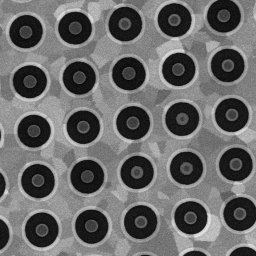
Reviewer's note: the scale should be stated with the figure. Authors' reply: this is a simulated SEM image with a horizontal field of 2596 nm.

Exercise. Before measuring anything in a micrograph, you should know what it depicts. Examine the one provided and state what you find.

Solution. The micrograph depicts an array of small figures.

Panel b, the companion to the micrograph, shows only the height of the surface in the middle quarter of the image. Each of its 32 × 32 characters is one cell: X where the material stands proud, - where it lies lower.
-------XXXXX--------XXXX---XX---
--------XXXX---XXX---XXX---XXX--
---XX---XXXX---XXX---XXX----X---
--XXX---XXXX---XX----XXXX-------
---XX---XXXX--------XXXXX-------
--------XXXXX-------XXXXXXX----X
-------XXXXXXX----XXXXXXXXXXXXXX
XX----XXXXXXXXXXXXXXXXXXXXXXXXXX
XXXXXXXXXXXXXXXXXXXXXXXXXXXXXXXX
XXXXXXXXXXXXXXXXXXXXXXXXXXXX---X
XXXXXXXXXXXXXXXX---XXXXXXX------
XXX---XXXXXXXX-------XXXX-------
XX------XXXXX--------XXXX-------
X--------XXXX----X----XXX----X--
---------XXXX---XX----XXX-------
----XX---XXXX---XX----XXX-------
----XX---XXXX---------XXXX------
X--------XXXXX-------XXXXXX-----
X-------XXXXXXX-----XXXXXXXXXXXX
XX------XXXXXXXXXXXXXXXXXXXXXXXX
XXXXXXXXXXXXXXXXXXXXXXXXXXXXXXXX
XXXXXXXXXXXXXXXXXXXXXXXXXXXXXX-X
XXXXXXXXXXXXXXXXXX-XXXXXXXXX----
XXXXXXXXXXXXXXXX-----XXXXXX-----
XXX------XXXXXX-------XXXX------
XX--------XXXX--------XXXX----X-
XX--------XXXX----X----XXX----X-
X----XX---XXXX---XX----XXX------
X---XXX---XXXX---------XXXX-----
X---------XXXX--------XXXXXX----
XX--------XXXXX------XXXXXXXXX-X
XXX------XXXXXXXX--XXXXXXXXXXXXX